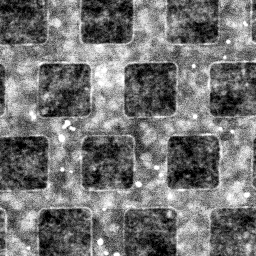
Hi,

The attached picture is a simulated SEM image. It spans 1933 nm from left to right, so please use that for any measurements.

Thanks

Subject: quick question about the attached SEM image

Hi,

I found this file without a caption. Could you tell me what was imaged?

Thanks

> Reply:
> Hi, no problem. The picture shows raised bodies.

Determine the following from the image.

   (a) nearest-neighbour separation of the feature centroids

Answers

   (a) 0.637 µm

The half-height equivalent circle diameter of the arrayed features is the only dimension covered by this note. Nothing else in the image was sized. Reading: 459 nm